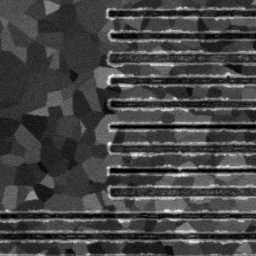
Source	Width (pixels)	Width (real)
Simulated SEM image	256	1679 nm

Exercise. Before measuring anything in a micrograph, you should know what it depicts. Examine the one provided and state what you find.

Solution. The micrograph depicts parallel lines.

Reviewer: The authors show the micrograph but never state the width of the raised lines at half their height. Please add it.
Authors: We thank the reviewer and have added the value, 0.0967 micrometres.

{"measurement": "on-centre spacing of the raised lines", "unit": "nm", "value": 146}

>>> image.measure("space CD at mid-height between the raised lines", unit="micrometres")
0.0459